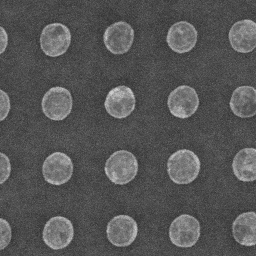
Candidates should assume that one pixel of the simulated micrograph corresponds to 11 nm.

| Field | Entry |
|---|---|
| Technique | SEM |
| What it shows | a regular array of raised bodies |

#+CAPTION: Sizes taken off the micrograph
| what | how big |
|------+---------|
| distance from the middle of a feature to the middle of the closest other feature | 63.1 px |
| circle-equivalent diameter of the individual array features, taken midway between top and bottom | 0.344 um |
